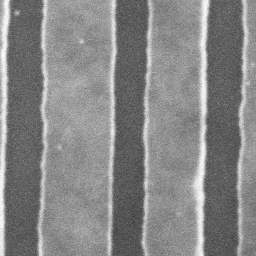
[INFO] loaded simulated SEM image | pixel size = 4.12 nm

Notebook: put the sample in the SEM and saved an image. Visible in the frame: lines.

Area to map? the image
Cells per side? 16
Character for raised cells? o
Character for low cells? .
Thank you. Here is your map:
...oooo..oooo..o
...oooo..oooo..o
...oooo..oooo..o
...oooo..oooo..o
...oooo..oooo..o
...oooo..oooo..o
...oooo..oooo..o
...oooo..oooo..o
...oooo..oooo..o
...oooo..oooo..o
...oooo..oooo..o
...oooo..oooo..o
...oooo..oooo..o
..ooooo..oooo..o
..ooooo..oooo..o
..ooooo..oooo..o